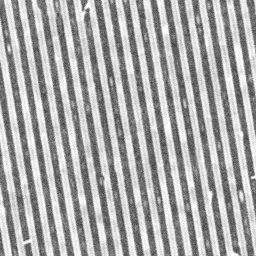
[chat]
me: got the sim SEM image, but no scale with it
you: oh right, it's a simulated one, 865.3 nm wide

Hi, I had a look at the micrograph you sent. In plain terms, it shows parallel lines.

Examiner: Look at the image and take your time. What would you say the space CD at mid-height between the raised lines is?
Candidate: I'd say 8.37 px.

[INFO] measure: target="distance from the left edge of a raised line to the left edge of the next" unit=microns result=0.0463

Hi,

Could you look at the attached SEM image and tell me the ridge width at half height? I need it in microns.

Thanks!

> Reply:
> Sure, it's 0.0191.